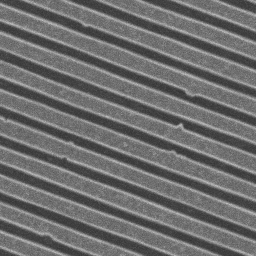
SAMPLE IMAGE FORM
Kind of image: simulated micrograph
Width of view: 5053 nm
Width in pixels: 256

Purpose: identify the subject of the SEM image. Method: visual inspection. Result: parallel lines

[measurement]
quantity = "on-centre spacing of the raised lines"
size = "524 nanometers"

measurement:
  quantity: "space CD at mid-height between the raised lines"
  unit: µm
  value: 0.201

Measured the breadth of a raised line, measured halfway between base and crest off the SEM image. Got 316 nm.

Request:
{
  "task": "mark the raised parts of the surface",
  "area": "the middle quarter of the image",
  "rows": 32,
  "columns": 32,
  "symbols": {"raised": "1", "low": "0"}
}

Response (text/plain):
11111110000000111111111111000000
11111111110000001111111111110000
11111111111100000001111111111110
00001111111111000000001111111111
00000011111111111000000001111111
00000000111111111111000000001111
11100000000111111111110000000011
11111100000000111111111111000001
11111111000000001111111111110000
11111111111000000001111111111110
00111111111111000000001111111111
00000111111111110000000011111111
10000000111111111110000000011111
11100000000111111111110000000011
11111100000000111111111110000000
11111111100000001111111111111100
11111111111100000001111111111100
00111111111111000000001111111111
00000111111111111000000011111111
10000000111111111111000000011111
11100000001111111111110000000011
11111100000001111111111110000000
11111111000000001111111111110000
01111111111000000011111111111110
00111111111111000000011111111111
00000111111111110000000011111111
10000000111111111110000000111111
11100000001111111111110000000111
11111000000001111111111100000000
11111111000000001111111111100000
11111111111000000001111111111100
00111111111111000000001111111111